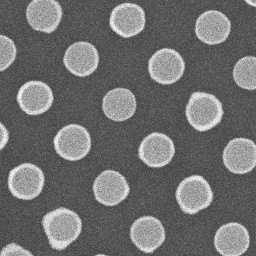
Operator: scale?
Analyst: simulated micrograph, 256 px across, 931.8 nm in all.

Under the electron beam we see a regular array of raised bodies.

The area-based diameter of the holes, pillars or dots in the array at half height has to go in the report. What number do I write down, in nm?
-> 127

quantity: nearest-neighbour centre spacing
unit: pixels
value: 58.4